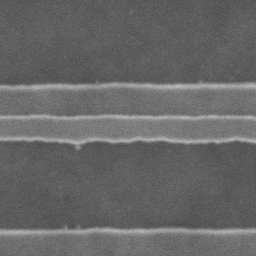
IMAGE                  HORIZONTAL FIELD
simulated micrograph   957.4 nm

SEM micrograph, lines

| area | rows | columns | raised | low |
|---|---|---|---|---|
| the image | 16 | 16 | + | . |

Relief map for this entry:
................
................
................
................
................
++++++++++++++++
++++++++++++++++
++++++++++++++++
++++++++++++++++
................
................
................
................
................
++++++++++++++++
++++++++++++++++